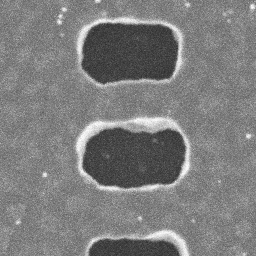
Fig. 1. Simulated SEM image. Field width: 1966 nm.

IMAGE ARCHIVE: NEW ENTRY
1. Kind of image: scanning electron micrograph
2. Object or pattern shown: holes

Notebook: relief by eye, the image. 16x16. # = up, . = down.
################
######....######
#####......#####
#####......#####
#####......#####
################
################
################
######.....#####
#####.......####
#####......#####
######....######
################
################
################
######.....#####